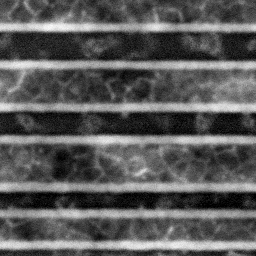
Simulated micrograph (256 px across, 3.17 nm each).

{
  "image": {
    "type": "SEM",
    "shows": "one or a few lines or trenches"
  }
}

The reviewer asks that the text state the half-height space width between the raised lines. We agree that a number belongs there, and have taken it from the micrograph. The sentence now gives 101 nanometers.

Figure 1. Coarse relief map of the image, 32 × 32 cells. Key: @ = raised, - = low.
@@@@@@@@@@@@@@@@@@@@@@@@@@@@@@@@
@@@@@@@@@@@@@@@@@@@@@@@@@@@@@@@@
@@@@@@@@@@@@@@@@@@@@@@@@@@@@@@@@
--------------------------------
--------------------------------
--------------------------------
--------------------------------
--------------------------------
@@@@@@@@@@@@@@@@@@@@@@@@@@@@@@@@
@@@@@@@@@@@@@@@@@@@@@@@@@@@@@@@@
@@@@@@@@@@@@@@@@@@@@@@@@@@@@@@@@
@@@@@@@@@@@@@@@@@@@@@@@@@@@@@@@@
@@@@@@@@@@@@@@@@@@@@@@@@@@@@@@@@
--------------------------------
--------------------------------
--------------------------------
--------------------------------
--------------------------------
@@@@@@@@@@@@@@@@@@@@@@@@@@@@@@@@
@@@@@@@@@@@@@@@@@@@@@@@@@@@@@@@@
@@@@@@@@@@@@@@@@@@@@@@@@@@@@@@@@
@@@@@@@@@@@@@@@@@@@@@@@@@@@@@@@@
@@@@@@@@@@@@@@@@@@@@@@@@@@@@@@@@
--------------@-----------------
--------------------------------
--------------------------------
--------------------------------
@@@@@@@@@@@@@@@@@@@@@@@@@@@@@@@@
@@@@@@@@@@@@@@@@@@@@@@@@@@@@@@@@
@@@@@@@@@@@@@@@@@@@@@@@@@@@@@@@@
@@@@@@@@@@@@@@@@@@@@@@@@@@@@@@@@
--------------------------------